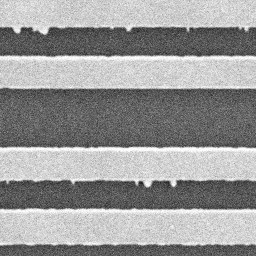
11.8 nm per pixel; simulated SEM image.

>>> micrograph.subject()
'lines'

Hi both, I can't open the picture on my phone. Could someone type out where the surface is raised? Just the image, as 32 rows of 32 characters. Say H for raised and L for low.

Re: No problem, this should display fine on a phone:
HHHHHHHHHHHHHHHHHHHHHHHHHHHHHHHH
HHHHHHHHHHHHHHHHHHHHHHHHHHHHHHHH
HHHHHHHHHHHHHHHHHHHHHHHHHHHHHHHH
LLHLHHLLLLLLLLLLLLLLLLLLLLLLLLLL
LLLLLLLLLLLLLLLLLLLLLLLLLLLLLLLL
LLLLLLLLLLLLLLLLLLLLLLLLLLLLLLLL
LLLLLLLLLLLLLLLLLLLLLLLLLLLLLLLL
HHHHHHHHHHHHHHHHHHHHHHHHHHHHHHHH
HHHHHHHHHHHHHHHHHHHHHHHHHHHHHHHH
HHHHHHHHHHHHHHHHHHHHHHHHHHHHHHHH
HHHHHHHHHHHHHHHHHHHHHHHHHHHHHHHH
LLLLLLLLLLLLLLLLLLLLLLLLLLLLLLLL
LLLLLLLLLLLLLLLLLLLLLLLLLLLLLLLL
LLLLLLLLLLLLLLLLLLLLLLLLLLLLLLLL
LLLLLLLLLLLLLLLLLLLLLLLLLLLLLLLL
LLLLLLLLLLLLLLLLLLLLLLLLLLLLLLLL
LLLLLLLLLLLLLLLLLLLLLLLLLLLLLLLL
LLLLLLLLLLLLLLLLLLLLLLLLLLLLLLLL
LLLLLLLLLLLLLLLLLLLLLLLLLLLLLLLL
HHHHHHHHHHHHHHHHHHHHHHHHHHHHHHHH
HHHHHHHHHHHHHHHHHHHHHHHHHHHHHHHH
HHHHHHHHHHHHHHHHHHHHHHHHHHHHHHHH
HLHLHHHHLHHHLLHHHHHHHHLLHHLLHHLH
LLLLLLLLLLLLLLLLLLLLLLLLLLLLLLLL
LLLLLLLLLLLLLLLLLLLLLLLLLLLLLLLL
LLLLLLLLLLLLLLLLLLLLLLLLLLLLLLLL
HHHHHHHHHHHHHHHHHHHHHHHHHHHHHHHH
HHHHHHHHHHHHHHHHHHHHHHHHHHHHHHHH
HHHHHHHHHHHHHHHHHHHHHHHHHHHHHHHH
HHHHHHHHHHHHHHHHHHHHHHHHHHHHHHHH
HLLHHLHLHHHHHLHLLHHHHLLHHHLHHHHL
LLLLLLLLLLLLLLLLLLLLLLLLLLLLLLLL